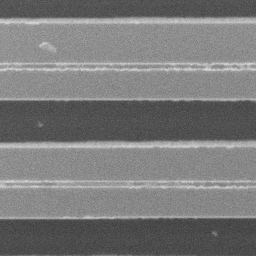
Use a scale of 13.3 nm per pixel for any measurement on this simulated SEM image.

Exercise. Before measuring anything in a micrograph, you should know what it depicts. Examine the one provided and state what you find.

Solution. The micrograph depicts lines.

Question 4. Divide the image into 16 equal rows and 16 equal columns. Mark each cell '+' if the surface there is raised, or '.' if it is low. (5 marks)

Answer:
................
++++++++++++++++
++++++++++++++++
++++++++++++++++
++++++++++++++++
++++++++++++++++
................
................
................
++++++++++++++++
++++++++++++++++
++++++++++++++++
++++++++++++++++
++++++++++++++++
................
................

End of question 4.